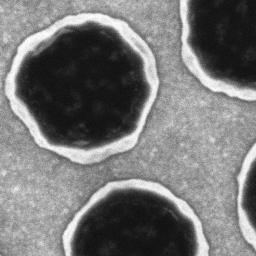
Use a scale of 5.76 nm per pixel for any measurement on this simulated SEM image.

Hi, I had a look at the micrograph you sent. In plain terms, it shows raised bodies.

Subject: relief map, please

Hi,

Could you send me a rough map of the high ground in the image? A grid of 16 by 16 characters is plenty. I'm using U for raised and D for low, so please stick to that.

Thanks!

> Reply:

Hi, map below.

DDDDDDDDDDDUUUUU
DDDDUUUDDDDUUUUU
DDUUUUUUDDDDUUUU
DUUUUUUUUDDDUUUU
DUUUUUUUUDDDUUUU
DUUUUUUUUUDDDDUU
DUUUUUUUUDDDDDDD
DDUUUUUUUDDDDDDD
DDUUUUUUDDDDDDDD
DDDDUUDDDDDDDDDD
DDDDDDDDDDDDDDDU
DDDDDDDUUDDDDDDU
DDDDDDUUUUUDDDDU
DDDDDUUUUUUUDDDU
DDDDUUUUUUUUDDDD
DDDDUUUUUUUUUDDD